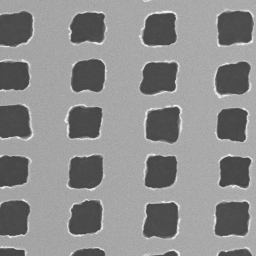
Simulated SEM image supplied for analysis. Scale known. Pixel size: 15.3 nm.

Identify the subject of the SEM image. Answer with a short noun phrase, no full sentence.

a regular array of holes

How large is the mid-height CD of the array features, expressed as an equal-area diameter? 533 nm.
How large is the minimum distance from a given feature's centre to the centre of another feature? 0.719 microns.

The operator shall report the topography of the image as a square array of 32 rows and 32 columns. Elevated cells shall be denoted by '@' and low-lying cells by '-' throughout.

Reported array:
@@@@@@@@@@@@@@@@@@@@@@@@@@@@@@@@
@@@@@@@@@@@-@@@@@@@@@@@@@@@@@--@
----@@@@@----@@@@@----@@@@@-----
----@@@@@----@@@@@----@@@@@-----
----@@@@@----@@@@@----@@@@@----@
--@@@@@@@@@@@@@@@@---@@@@@@@-@@@
@@@@@@@@@@@@@@@@@@@@@@@@@@@@@@@@
@@@@@@@@@@@-@@@@@@@@@@@@@@@@@@@@
---@@@@@@----@@@@@----@@@@@----@
----@@@@@----@@@@@----@@@@@----@
----@@@@@----@@@@@----@@@@@----@
@@@@@@@@@@@@@@@@@@--@@@@@@@----@
@@@@@@@@@@@@@@@@@@@@@@@@@@@@@@@@
---@@@@@@---@@@@@@@@@-@@@@@@@-@@
----@@@@@----@@@@@----@@@@@----@
----@@@@@----@@@@@----@@@@@----@
----@@@@@---@@@@@@----@@@@@----@
@@@@@@@@@@@@@@@@@@@---@@@@@@@--@
@@@@@@@@@@@@@@@@@@@@@@@@@@@@@@@@
-@@@@@@@@@@@@@@@@@@--@@@@@@@@@@@
----@@@@@----@@@@@----@@@@@@---@
---@@@@@@----@@@@@----@@@@@@---@
---@@@@@@----@@@@@----@@@@@@---@
@@@@@@@@@---@@@@@@@-@@@@@@@@@@@@
@@@@@@@@@@@@@@@@@@@@@@@@@@@@@@@@
---@@@@@@@--@@@@@@@---@@@@@----@
----@@@@@----@@@@@----@@@@@----@
----@@@@@----@@@@@----@@@@@----@
---@@@@@@---@@@@@@----@@@@@----@
@@@@@@@@@@@@@@@@@@----@@@@@@@@@@
@@@@@@@@@@@@@@@@@@@@@@@@@@@@@@@@
---@@@@@@----@@@@@@@@-@@@@@@---@